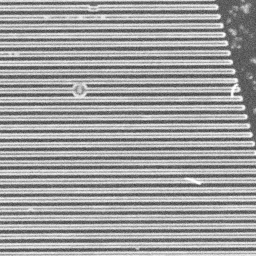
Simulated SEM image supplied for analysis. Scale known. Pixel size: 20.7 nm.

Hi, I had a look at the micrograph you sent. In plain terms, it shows parallel lines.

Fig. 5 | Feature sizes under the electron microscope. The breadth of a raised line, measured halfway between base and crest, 3.25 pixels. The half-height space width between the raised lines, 0.117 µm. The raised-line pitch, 0.189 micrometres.